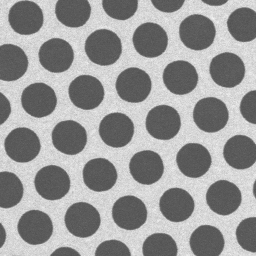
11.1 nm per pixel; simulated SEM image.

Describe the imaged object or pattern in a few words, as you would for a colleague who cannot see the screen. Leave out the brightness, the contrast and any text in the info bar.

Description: a regular array of holes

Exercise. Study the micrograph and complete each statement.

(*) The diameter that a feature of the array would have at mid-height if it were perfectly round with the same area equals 398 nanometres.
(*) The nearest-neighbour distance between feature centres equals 529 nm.